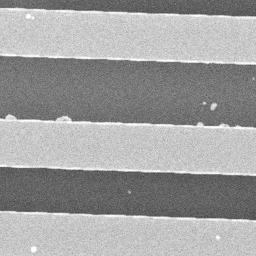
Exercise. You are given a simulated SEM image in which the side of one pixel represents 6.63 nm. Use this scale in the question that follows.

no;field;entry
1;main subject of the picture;lines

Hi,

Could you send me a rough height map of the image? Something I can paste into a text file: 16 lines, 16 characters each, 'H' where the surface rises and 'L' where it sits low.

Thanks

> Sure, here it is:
LLLLLLLLLLLLLLLL
HHHHHHHHHHHHHHHH
HHHHHHHHHHHHHHHH
LLHHHHHHHHHHHHHH
LLLLLLLLLLLLLLLL
LLLLLLLLLLLLLLLL
LLLLLLLLLLLLLLLL
HLLLLLLLLLLLLLLL
HHHHHHHHHHHHHHHH
HHHHHHHHHHHHHHHH
LLLLHHHHHHHHHHHH
LLLLLLLLLLLLLLLL
LLLLLLLLLLLLLLLL
HHHHHHHHLLLLLLLL
HHHHHHHHHHHHHHHH
HHHHHHHHHHHHHHHH